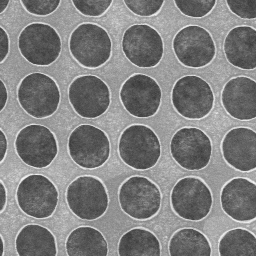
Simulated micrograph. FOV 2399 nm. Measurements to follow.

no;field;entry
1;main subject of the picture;a regular array of holes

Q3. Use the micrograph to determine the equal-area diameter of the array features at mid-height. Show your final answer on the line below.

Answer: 396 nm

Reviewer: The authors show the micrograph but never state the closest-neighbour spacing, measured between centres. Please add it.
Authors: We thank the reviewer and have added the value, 472 nanometres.